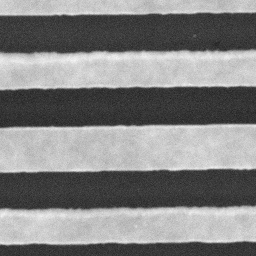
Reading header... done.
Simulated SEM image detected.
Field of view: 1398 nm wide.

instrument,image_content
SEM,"lines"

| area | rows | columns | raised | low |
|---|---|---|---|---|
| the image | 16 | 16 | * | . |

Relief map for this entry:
****************
................
................
****************
****************
***.............
................
................
****************
****************
****************
................
................
****************
****************
................